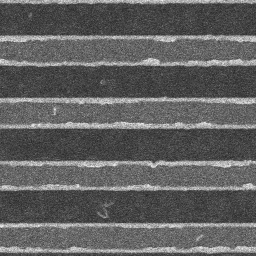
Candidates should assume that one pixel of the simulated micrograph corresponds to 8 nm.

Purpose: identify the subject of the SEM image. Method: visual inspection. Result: one or a few lines or trenches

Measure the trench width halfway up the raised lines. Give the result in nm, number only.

278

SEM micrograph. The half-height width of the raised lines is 0.22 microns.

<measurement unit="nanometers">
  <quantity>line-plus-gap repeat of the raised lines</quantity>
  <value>499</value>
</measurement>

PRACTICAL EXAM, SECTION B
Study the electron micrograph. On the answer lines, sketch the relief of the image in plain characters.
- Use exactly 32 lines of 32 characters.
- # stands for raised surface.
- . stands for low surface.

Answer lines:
................................
................................
................................
................................
................................
################################
################################
################################
................................
................................
................................
................................
###############.##.##.#..#..##.#
################################
################################
################################
................................
................................
................................
................................
################################
################################
################################
################################
................................
................................
................................
................................
################################
################################
################################
..........................#.....